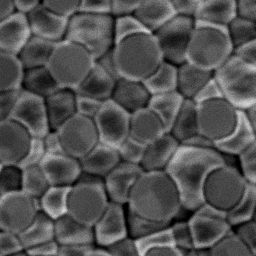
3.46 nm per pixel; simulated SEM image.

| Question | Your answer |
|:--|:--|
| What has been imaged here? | a regular array of raised bodies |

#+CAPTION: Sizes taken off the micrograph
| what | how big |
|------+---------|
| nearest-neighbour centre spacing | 35.2 px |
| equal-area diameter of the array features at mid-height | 129 nm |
